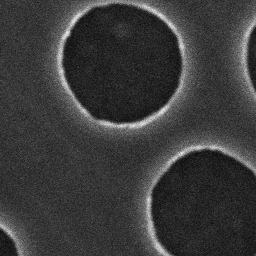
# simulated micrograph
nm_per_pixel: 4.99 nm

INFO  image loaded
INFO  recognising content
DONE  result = holes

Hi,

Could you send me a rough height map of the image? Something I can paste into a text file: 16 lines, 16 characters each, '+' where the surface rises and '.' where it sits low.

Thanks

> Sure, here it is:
++++++...+++++++
+++++.....++++++
++++.......++++.
++++.......++++.
++++.......++++.
++++.......+++++
+++++.....++++++
++++++...+++++++
++++++++++++++++
++++++++++++..++
+++++++++++.....
++++++++++......
+++++++++.......
+++++++++.......
++++++++++......
.+++++++++......